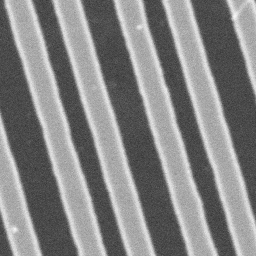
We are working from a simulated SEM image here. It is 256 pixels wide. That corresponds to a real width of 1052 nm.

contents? lines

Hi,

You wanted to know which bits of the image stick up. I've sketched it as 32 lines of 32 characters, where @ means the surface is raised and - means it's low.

-@@@---@@@----@@@@---@@@-----@@@
-@@@---@@@-----@@@---@@@-----@@@
-@@@@--@@@@----@@@---@@@-----@@@
--@@@---@@@----@@@---@@@@-----@@
--@@@---@@@-----@@@---@@@-----@@
--@@@@--@@@@----@@@---@@@-----@@
--@@@@---@@@----@@@---@@@-----@@
---@@@---@@@-----@@@---@@@-----@
---@@@---@@@-----@@@---@@@-----@
---@@@@--@@@@----@@@---@@@-----@
----@@@---@@@----@@@@--@@@@-----
----@@@---@@@-----@@@---@@@-----
----@@@---@@@@----@@@---@@@-----
-----@@@---@@@----@@@@--@@@@----
-----@@@---@@@-----@@@---@@@----
-----@@@---@@@@----@@@---@@@----
@-----@@@---@@@----@@@---@@@@---
@-----@@@---@@@----@@@@--@@@@---
@-----@@@---@@@-----@@@---@@@---
@-----@@@@--@@@@----@@@---@@@---
@@-----@@@---@@@----@@@@--@@@@--
@@-----@@@---@@@-----@@@---@@@--
@@-----@@@---@@@-----@@@---@@@--
@@@----@@@@---@@@----@@@---@@@@-
@@@-----@@@---@@@----@@@@---@@@-
@@@-----@@@---@@@-----@@@---@@@-
@@@-----@@@@--@@@@----@@@---@@@-
@@@@-----@@@---@@@----@@@@---@@@
-@@@-----@@@---@@@-----@@@---@@@
-@@@-----@@@@--@@@@----@@@---@@@
-@@@@-----@@@---@@@----@@@@--@@@
--@@@-----@@@---@@@-----@@@---@@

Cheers